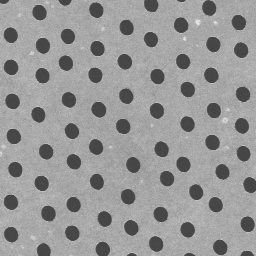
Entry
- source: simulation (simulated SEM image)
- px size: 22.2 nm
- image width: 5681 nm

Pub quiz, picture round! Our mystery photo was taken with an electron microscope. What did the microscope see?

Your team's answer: a regular array of holes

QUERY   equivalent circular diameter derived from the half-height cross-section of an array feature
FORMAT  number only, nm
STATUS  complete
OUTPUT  335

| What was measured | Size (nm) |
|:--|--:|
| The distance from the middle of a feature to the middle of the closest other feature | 644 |